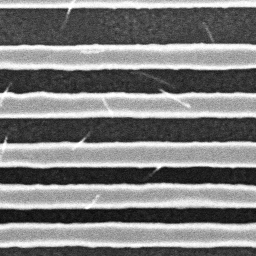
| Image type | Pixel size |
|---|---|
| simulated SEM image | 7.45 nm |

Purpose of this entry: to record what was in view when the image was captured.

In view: lines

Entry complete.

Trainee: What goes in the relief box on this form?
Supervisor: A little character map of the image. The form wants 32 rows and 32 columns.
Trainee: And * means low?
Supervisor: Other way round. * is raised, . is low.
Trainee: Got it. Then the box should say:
********************************
................................
................................
................................
................................
................................
********************************
********************************
********************************
................................
................................
.....*..........................
********************************
********************************
********************************
................................
................................
................................
********************************
********************************
********************************
................................
................................
********************************
********************************
********************************
................................
................................
********************************
********************************
********************************
................................